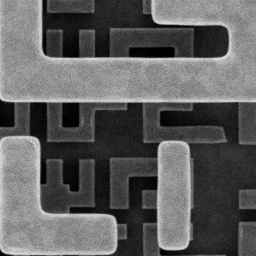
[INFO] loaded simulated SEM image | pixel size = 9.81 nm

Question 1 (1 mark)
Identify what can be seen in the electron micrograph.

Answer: wiring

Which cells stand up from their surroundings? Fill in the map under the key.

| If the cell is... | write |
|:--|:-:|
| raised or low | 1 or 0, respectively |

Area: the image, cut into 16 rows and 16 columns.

1110000001111111
1110000000011111
1110000000000011
1110000000000011
1111111111111111
1111111111111111
0000000000000000
0000000000000000
0000000000000000
1100000000110000
1100000000110000
1100000000110000
1110000000110000
1111111000110000
1111111000110000
1111111000100000